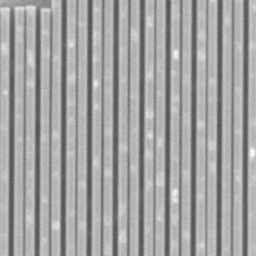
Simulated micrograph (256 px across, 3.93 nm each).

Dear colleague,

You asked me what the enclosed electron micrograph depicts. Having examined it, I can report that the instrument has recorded parallel lines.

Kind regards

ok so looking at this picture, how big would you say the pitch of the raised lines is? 50.6 nanometers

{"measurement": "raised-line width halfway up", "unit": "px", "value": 9.77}